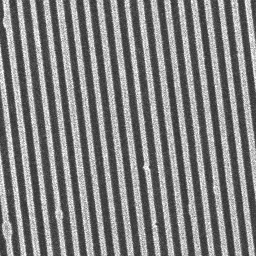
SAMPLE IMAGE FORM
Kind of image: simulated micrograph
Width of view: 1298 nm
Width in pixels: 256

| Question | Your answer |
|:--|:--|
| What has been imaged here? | parallel lines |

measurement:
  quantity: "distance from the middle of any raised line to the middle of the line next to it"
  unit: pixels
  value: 13.3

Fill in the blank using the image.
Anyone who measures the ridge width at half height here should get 6.07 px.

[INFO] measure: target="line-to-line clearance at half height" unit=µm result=0.0352